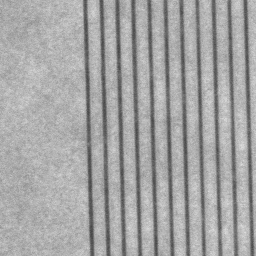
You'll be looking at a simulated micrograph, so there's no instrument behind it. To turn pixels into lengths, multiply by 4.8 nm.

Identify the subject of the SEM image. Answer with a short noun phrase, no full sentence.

parallel lines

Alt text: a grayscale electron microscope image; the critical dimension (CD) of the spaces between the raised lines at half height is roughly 0.0204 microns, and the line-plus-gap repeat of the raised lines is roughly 76.8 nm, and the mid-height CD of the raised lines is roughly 53.3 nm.